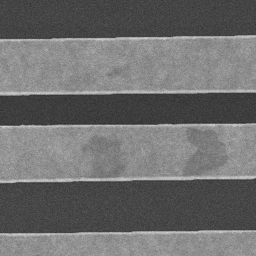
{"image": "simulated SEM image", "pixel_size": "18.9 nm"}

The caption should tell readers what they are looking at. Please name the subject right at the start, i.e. lines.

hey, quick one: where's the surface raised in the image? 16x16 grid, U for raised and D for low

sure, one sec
DDDDDDDDDDDDDDDD
DDDDDDDDDDDDDDDD
UUUUUUUUUUUUUUUU
UUUUUUUUUUUUUUUU
UUUUUUUUUUUUUUUU
UUUUUUUUUUUUUUUU
DDDDDDDDDDDDDDDD
DDDDDDDDDDDDDDDD
UUUUUUUUUUUUUUUU
UUUUUUUUUUUUUUUU
UUUUUUUUUUUUUUUU
DDDDDDDDDDDDDDDD
DDDDDDDDDDDDDDDD
DDDDDDDDDDDDDDDD
DDDDDDDDUUUUUUUU
UUUUUUUUUUUUUUUU